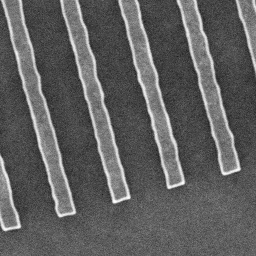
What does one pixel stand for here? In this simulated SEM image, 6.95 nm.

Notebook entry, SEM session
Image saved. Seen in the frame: groups of lines, slits or small figures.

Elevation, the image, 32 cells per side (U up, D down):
UUUDDDDDUUDDDDDUUDDDDDUUUDDDDDUU
DUUDDDDDUUDDDDDUUDDDDDDUUDDDDDUU
DUUDDDDDUUDDDDDDUUDDDDDUUDDDDDUU
DUUDDDDDUUUDDDDDUUDDDDDUUDDDDDDU
DUUDDDDDDUUDDDDDUUDDDDDUUUDDDDDU
DDUUDDDDDUUDDDDDUUDDDDDDUUDDDDDU
DDUUDDDDDUUDDDDDDUUDDDDDUUDDDDDU
DDUUDDDDDDUUDDDDDUUDDDDDUUDDDDDD
DDUUDDDDDDUUDDDDDUUDDDDDUUUDDDDD
DDDUUDDDDDUUDDDDDUUUDDDDDUUDDDDD
DDDUUDDDDDUUDDDDDDUUDDDDDUUDDDDD
DDDUUDDDDDDUUDDDDDUUDDDDDUUDDDDD
DDDUUUDDDDDUUDDDDDUUDDDDDDUUDDDD
DDDDUUDDDDDUUDDDDDDUUDDDDDUUDDDD
DDDDUUDDDDDUUUDDDDDUUDDDDDUUDDDD
DDDDUUDDDDDDUUDDDDDUUDDDDDUUDDDD
DDDDDUUDDDDDUUDDDDDUUDDDDDDUUDDD
DDDDDUUDDDDDUUDDDDDDUUDDDDDUUDDD
DDDDDUUDDDDDUUUDDDDDUUDDDDDUUDDD
DDDDDUUUDDDDDUUDDDDDUUDDDDDUUUDD
DDDDDDUUDDDDDUUDDDDDUUDDDDDUUUDD
UDDDDDUUDDDDDUUDDDDDDUUDDDDDUDDD
UDDDDDUUDDDDDUUUDDDDDUUDDDDDDDDD
UDDDDDDUUDDDDDUUDDDDDDDDDDDDDDDD
UDDDDDDUUDDDDDUUDDDDDDDDDDDDDDDD
UUDDDDDUUDDDDDDDDDDDDDDDDDDDDDDD
UUDDDDDUUDDDDDDDDDDDDDDDDDDDDDDD
UUDDDDDDDDDDDDDDDDDDDDDDDDDDDDDD
UUDDDDDDDDDDDDDDDDDDDDDDDDDDDDDD
DDDDDDDDDDDDDDDDDDDDDDDDDDDDDDDD
DDDDDDDDDDDDDDDDDDDDDDDDDDDDDDDD
DDDDDDDDDDDDDDDDDDDDDDDDDDDDDDDD